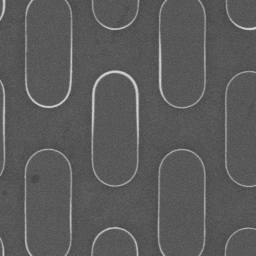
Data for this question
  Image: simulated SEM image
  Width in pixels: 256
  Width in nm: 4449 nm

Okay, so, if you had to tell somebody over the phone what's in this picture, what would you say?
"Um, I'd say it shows groups of lines, slits or small figures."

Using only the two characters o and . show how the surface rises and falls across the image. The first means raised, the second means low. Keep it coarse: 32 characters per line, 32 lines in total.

o...ooooo...ooooo...ooooo...oooo
...oooooo...ooooo...oooooo..oooo
...oooooo...ooooo...oooooo...ooo
...oooooo.....o.....oooooo....oo
...oooooo...........oooooo......
...oooooo...........oooooo......
...oooooo...........oooooo......
...oooooo...........oooooo......
...oooooo...........oooooo......
...oooooo....ooo....oooooo...ooo
...oooooo...ooooo...oooooo...ooo
o..oooooo...ooooo...ooooo...oooo
o...oooo....ooooo....oooo...oooo
o...........ooooo...........oooo
............ooooo...........oooo
............ooooo...........oooo
o...........ooooo...........oooo
o...........ooooo...........oooo
o...........ooooo...........oooo
o...oooo....ooooo....oooo...oooo
o..oooooo...ooooo...ooooo...oooo
...oooooo...ooooo...oooooo..oooo
...oooooo...oooo....oooooo...ooo
...oooooo...........oooooo......
...oooooo...........oooooo......
...oooooo...........oooooo......
...oooooo...........oooooo......
...oooooo...........oooooo......
...oooooo...........oooooo......
...oooooo...ooooo...oooooo...ooo
...oooooo...ooooo...oooooo..oooo
....oooo....ooooo...ooooo...oooo